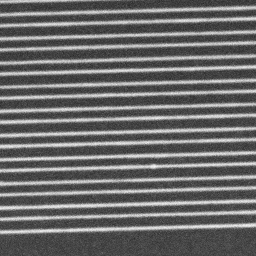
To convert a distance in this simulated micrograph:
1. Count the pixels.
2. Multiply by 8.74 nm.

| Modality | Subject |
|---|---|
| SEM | parallel lines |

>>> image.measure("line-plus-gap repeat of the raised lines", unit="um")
0.105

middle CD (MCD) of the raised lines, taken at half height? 21.8 nanometers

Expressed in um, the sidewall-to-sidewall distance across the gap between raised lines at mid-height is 0.0884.